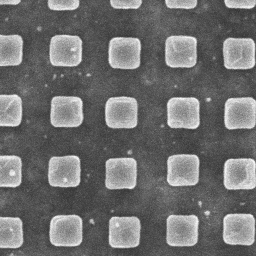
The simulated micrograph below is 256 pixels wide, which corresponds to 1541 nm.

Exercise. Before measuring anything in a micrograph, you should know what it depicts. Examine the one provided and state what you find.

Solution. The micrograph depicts a regular array of raised bodies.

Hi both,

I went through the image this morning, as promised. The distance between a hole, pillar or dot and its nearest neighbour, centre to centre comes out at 343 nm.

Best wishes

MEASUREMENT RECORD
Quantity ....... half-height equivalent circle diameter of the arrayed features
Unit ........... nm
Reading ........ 203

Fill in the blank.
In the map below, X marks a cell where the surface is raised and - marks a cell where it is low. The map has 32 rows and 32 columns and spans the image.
XX----XXXX----XXX----XXX----XXXX
--------------------------------
--------------------------------
--------------------------------
XX------------------------------
XXX---XXXX----XXX----XXX----XXXX
XXX---XXXX----XXX----XXX----XXXX
XXX---XXXX----XXX----XXX----XXXX
---------------XX-------------X-
--------------------------------
--------------------------------
--------------------------------
XXX----XXX----XXX----XXXX----XXX
XXX---XXXX---XXXX----XXXX---XXXX
XXX---XXXX---XXXX----XXXX---XXXX
XX-----XXX---XXXX----XXXX---XXXX
--------------------------------
--------------------------------
--------------------------------
----------------------XX--------
XXX---XXXX---XXXX----XXXX---XXXX
XXX---XXXX---XXXX----XXXX---XXXX
XXX---XXXX---XXXX----XXXX---XXXX
--------------X--------------XX-
--------------------------------
--------------------------------
--------------------------------
XX-----XXX----XXX----XXXX---XXXX
XXX---XXXX----XXX----XXXX---XXXX
XXX---XXXX----XXX----XXXX---XXXX
XXX----XXX----XXX----XXX------X-
--------------------------------